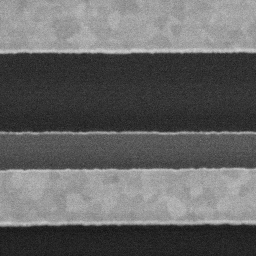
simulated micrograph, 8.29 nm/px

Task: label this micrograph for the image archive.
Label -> lines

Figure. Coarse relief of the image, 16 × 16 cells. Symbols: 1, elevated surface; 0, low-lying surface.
1111111111111111
1111111111111111
1111111111111111
0000000000000000
0000000000000000
0000000000000000
0000000000000000
0000000000000000
1111111111111111
1111111111111111
1111111111111111
1111111111111111
1111111111111111
1111111111111111
0000000000000000
0000000000000000